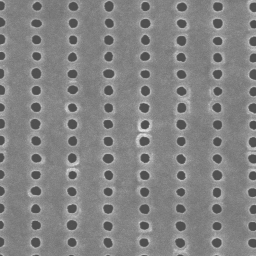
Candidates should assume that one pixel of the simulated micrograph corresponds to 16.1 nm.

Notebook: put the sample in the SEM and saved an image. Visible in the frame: a regular array of holes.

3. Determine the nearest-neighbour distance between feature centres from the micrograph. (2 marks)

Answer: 0.266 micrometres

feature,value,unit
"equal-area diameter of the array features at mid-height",153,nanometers